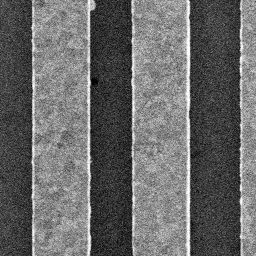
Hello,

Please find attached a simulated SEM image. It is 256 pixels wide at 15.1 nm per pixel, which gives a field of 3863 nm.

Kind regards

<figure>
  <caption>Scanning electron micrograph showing lines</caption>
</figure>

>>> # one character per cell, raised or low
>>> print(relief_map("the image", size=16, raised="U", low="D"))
DDUUUUDDUUUUDDDU
DDUUUUDDUUUUDDDU
DDUUUUDDUUUUDDDU
DDUUUUDDUUUUDDDU
DDUUUUDDUUUUDDDU
DDUUUUDDUUUUDDDU
DDUUUUDDUUUUDDDU
DDUUUUDDUUUUDDDU
DDUUUUDDUUUUDDDU
DDUUUUDDUUUUDDDU
DDUUUUDDUUUUDDDU
DDUUUUDDUUUUDDDU
DDUUUUDDUUUUDDDU
DDUUUUDDUUUUDDDU
DDUUUUDDUUUUDDDU
DDUUUUDDUUUUDDDU